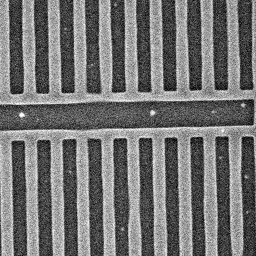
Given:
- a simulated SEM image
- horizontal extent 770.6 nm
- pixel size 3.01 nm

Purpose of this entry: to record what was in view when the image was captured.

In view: groups of lines, slits or small figures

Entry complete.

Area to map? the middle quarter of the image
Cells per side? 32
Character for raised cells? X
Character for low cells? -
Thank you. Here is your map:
---XX----XXX---XXX----XXX---XXX-
---XX----XXX---XXX----XXX---XXX-
---XX----XXX---XXX----XXX---XXX-
---XX----XXX---XXX----XXX---XXX-
---XX----XXX----XX----XXX---XXX-
---XX----XXX----XX----XXX---XXX-
---XX-----XX----XX----XXX---XXXX
XXXXXX---XXXXXXXXXXXXXXXXXXXXXXX
XXXXXXXXXXXXXXXXXXXXXXXXXXXXXXXX
XXX-----------------------------
--------------------------------
--------------------------------
--------------------------------
--------------------------------
--------------------------------
--------------------------------
--------XXXXXXXXXXXXXXXXXXXXXXXX
XXXXXXXXXXXXXXXXXXXXXXXXXXXXXXXX
X--XXX---XXXX--XXXX---XXX---XXXX
---XXX---XXX----XXX---XXX----XX-
---XXX----XX----XXX---XXX----XX-
---XXX----XX----XXX---XXX----XX-
---XXX----XX----XXX---XXX----XXX
---XXX----XX----XXX---XXX----XXX
---XXX----XX----XXX---XXX----XXX
---XXX----XX----XXX---XXX----XXX
---XXX----XX----XXX---XXX----XXX
---XXX----XX----XXX---XXX----XXX
---XXX----XX----XXX---XXX----XXX
---XXX----XX----XXX---XXX----XXX
---XXX----XX----XXX---XXX----XXX
---XXX----XX----XXX---XXX----XXX